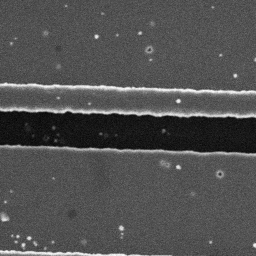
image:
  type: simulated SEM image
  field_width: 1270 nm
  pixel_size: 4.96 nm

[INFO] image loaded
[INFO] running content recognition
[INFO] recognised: lines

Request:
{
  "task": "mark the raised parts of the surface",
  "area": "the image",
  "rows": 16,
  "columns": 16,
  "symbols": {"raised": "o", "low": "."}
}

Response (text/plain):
oooooooooooooooo
oooooooooooooooo
oooooooooooooooo
oooooooooooooooo
oooooooooooooooo
oooooooooooooooo
oooooooooooooooo
................
................
oooooooooooo....
oooooooooooooooo
oooooooooooooooo
oooooooooooooooo
oooooooooooooooo
oooooooooooooooo
oooooooooooooooo